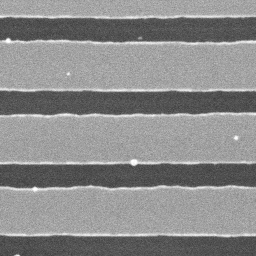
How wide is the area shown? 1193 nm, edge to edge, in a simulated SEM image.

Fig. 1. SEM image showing lines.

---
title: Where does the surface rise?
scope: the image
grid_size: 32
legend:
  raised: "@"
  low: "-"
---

@@@@@@@@@@@@@@@@@@@@@@@@@@@@@@@@
@@@@@@@@@@@@@@@@@@@@@@@@@@@@@@@@
--------------------------------
--------------------------------
--------------------------------
@@@@@@@@@@@@@@@@@@@@@@@@@@@@@@@@
@@@@@@@@@@@@@@@@@@@@@@@@@@@@@@@@
@@@@@@@@@@@@@@@@@@@@@@@@@@@@@@@@
@@@@@@@@@@@@@@@@@@@@@@@@@@@@@@@@
@@@@@@@@@@@@@@@@@@@@@@@@@@@@@@@@
@@@@@@@@@@@@@@@@@@@@@@@@@@@@@@@@
--------------------------------
--------------------------------
--------------------------------
-@@@@@@@@@@@@@-@@@@@@@@@@@@@@@@@
@@@@@@@@@@@@@@@@@@@@@@@@@@@@@@@@
@@@@@@@@@@@@@@@@@@@@@@@@@@@@@@@@
@@@@@@@@@@@@@@@@@@@@@@@@@@@@@@@@
@@@@@@@@@@@@@@@@@@@@@@@@@@@@@@@@
@@@@@@@@@@@@@@@@@@@@@@@@@@@@@@@@
----------------@---------------
--------------------------------
--------------------------------
@@--@-@@@@@@@@@@@@@@@@@@@@@@@@@@
@@@@@@@@@@@@@@@@@@@@@@@@@@@@@@@@
@@@@@@@@@@@@@@@@@@@@@@@@@@@@@@@@
@@@@@@@@@@@@@@@@@@@@@@@@@@@@@@@@
@@@@@@@@@@@@@@@@@@@@@@@@@@@@@@@@
@@@@@@@@@@@@@@@@@@@@@@@@@@@@@@@@
---------------------------@@---
--------------------------------
--------------------------------